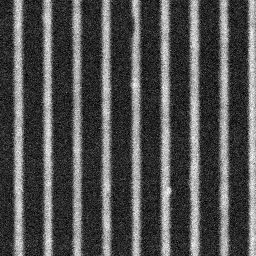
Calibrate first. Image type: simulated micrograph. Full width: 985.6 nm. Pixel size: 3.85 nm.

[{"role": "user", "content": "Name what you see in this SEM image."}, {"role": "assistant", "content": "parallel lines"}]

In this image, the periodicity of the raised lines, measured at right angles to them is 113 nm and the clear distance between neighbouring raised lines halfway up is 92.3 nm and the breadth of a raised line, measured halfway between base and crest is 21.2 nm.